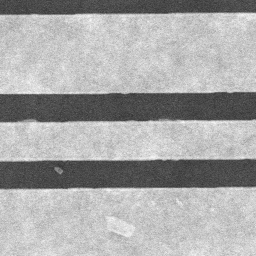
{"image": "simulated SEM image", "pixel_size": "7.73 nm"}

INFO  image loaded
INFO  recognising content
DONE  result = lines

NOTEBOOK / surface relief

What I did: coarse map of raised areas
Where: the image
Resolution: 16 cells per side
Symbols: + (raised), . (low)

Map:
................
++++++++++++++++
++++++++++++++++
++++++++++++++++
++++++++++++++++
++++++++++++++++
................
...............+
++++++++++++++++
++++++++++++++++
................
................
++++++++++++++++
++++++++++++++++
++++++++++++++++
++++++++++++++++